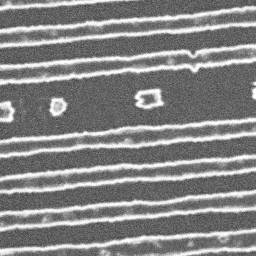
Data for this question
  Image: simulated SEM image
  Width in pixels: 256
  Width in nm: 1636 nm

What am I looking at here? parallel lines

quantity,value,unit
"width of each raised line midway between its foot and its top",103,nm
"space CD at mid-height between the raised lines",0.137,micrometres